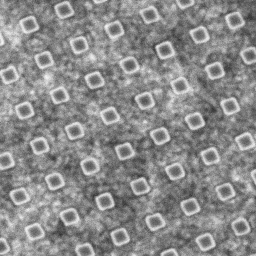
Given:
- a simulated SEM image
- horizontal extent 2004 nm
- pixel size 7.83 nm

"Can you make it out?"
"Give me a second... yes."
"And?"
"a regular array of raised bodies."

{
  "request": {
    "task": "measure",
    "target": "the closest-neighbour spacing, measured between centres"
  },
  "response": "0.298 µm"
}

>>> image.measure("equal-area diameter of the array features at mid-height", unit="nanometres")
131